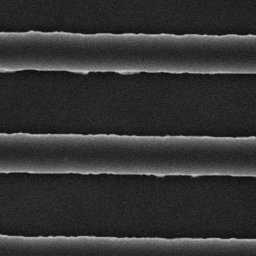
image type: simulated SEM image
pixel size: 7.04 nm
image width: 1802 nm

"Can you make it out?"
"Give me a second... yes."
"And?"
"lines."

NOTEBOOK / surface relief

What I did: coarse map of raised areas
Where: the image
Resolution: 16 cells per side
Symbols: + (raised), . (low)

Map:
................
................
++++++++++++++++
++++++++++++++++
...........+++++
................
................
................
++++++++........
++++++++++++++++
++++++++++++++++
................
................
................
................
++++++++++++++++